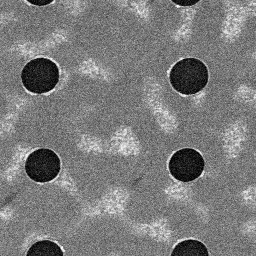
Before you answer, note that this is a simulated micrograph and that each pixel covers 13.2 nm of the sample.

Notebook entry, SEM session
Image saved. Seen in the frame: holes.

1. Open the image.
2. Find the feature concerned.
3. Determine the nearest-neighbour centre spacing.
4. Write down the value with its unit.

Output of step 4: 1170 nm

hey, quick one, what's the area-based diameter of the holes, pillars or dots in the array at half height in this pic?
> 480 nanometers